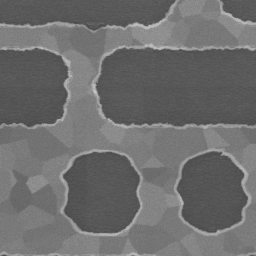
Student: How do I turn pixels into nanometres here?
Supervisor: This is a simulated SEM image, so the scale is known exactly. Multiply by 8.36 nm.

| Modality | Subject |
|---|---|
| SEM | one or a few lines or trenches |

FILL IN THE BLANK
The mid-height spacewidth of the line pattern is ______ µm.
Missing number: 0.645